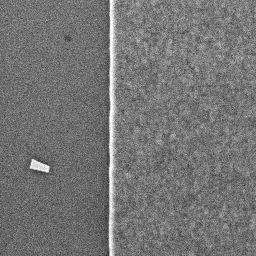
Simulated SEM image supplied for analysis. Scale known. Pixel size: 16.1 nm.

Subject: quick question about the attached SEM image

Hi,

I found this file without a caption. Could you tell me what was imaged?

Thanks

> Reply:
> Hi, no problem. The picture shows wiring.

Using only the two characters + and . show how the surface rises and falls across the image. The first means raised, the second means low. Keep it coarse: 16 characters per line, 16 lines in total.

.......+++++++++
.......+++++++++
.......+++++++++
.......+++++++++
.......+++++++++
.......+++++++++
.......+++++++++
.......+++++++++
.......+++++++++
.......+++++++++
.......+++++++++
.......+++++++++
.......+++++++++
.......+++++++++
.......+++++++++
.......+++++++++